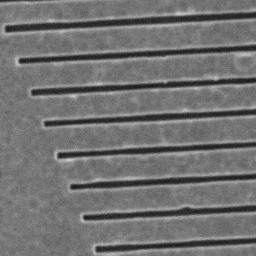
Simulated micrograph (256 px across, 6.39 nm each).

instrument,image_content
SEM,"parallel lines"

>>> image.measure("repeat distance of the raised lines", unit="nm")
205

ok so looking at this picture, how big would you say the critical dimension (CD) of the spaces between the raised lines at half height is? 42.3 nm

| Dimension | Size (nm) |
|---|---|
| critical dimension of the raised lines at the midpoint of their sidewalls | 161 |